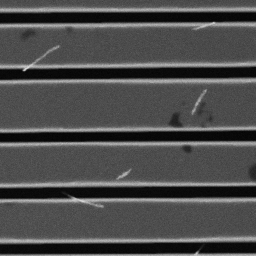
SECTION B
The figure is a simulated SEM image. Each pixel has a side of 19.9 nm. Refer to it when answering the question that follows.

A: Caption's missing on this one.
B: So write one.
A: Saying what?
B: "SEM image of lines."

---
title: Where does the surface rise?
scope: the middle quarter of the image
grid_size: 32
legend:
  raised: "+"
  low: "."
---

++++++++++++++++++++++++++++++++
................................
................................
................................
++++++++++++++++++++++++++++++++
++++++++++++++++++++++++++++++++
++++++++++++++++++++++++++++++++
++++++++++++++++++++++++++++++++
++++++++++++++++++++++++++++++++
++++++++++++++++++++++++++++++++
++++++++++++++++++++++++++++++++
++++++++++++++++++++++++++++++++
++++++++++++++++++++++++++++++++
++++++++++++++++++++++++++++++++
++++++++++++++++++++++++++++++++
++++++++++++++++++++++++++++++++
++++++++++++++++++++++++++++++++
................................
................................
........................++++++++
++++++++++++++++++++++++++++++++
++++++++++++++++++++++++++++++++
++++++++++++++++++++++++++++++++
++++++++++++++++++++++++++++++++
++++++++++++++++++++++++++++++++
++++++++++++++++++++++++++++++++
++++++++++++++++++++++++++++++++
++++++++++++++++++++++++++++++++
++++++++++++++++++++++++++++++++
++++++++++++++++++++++++++++++++
++++++++++++++++++++++++++++++++
................................